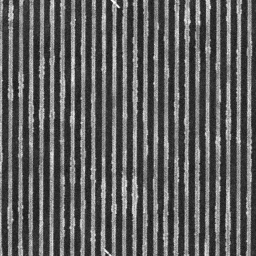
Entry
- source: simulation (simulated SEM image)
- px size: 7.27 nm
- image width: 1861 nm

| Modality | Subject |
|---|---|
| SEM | parallel lines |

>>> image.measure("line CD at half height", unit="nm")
25.5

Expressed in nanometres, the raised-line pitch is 75.5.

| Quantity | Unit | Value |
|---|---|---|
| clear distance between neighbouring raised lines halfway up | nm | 50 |